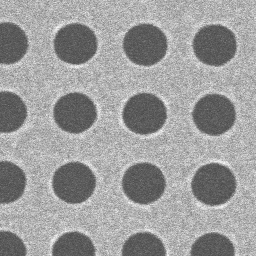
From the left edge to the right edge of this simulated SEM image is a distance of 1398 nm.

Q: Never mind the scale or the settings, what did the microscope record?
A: a regular array of holes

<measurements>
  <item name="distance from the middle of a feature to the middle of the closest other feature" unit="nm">379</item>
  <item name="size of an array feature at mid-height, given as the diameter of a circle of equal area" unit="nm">236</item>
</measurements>